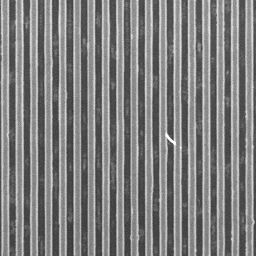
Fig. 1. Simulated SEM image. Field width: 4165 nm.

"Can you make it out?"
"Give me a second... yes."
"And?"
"parallel lines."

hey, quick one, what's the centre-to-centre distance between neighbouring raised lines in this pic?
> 0.234 um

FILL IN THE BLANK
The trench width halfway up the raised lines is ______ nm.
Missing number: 124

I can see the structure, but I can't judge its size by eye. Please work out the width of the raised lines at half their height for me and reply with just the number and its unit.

6.75 pixels